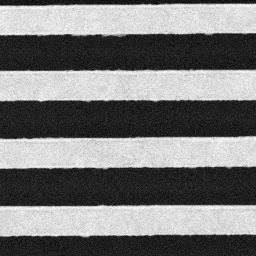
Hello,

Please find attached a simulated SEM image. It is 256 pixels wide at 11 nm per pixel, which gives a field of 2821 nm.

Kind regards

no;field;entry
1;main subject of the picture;lines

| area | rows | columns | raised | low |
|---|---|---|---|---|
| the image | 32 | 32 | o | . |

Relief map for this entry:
................................
oooooooooooooooooooooooooooooooo
oooooooooooooooooooooooooooooooo
oooooooooooooooooooooooooooooooo
................................
................................
................................
................................
................................
oooooooooooooooooooooooooooooooo
oooooooooooooooooooooooooooooooo
oooooooooooooooooooooooooooooooo
oo..oo....o.....................
................................
................................
................................
................................
oooooooooooooooooooooooooooooooo
oooooooooooooooooooooooooooooooo
oooooooooooooooooooooooooooooooo
oooooooooooooooooooooooooooooooo
................................
................................
................................
................................
................................
oooooooooooooooooooooooooooooooo
oooooooooooooooooooooooooooooooo
oooooooooooooooooooooooooooooooo
ooo.ooo.........................
................................
................................